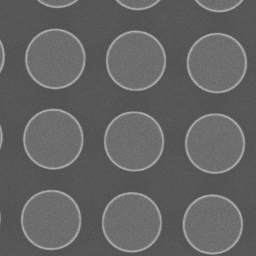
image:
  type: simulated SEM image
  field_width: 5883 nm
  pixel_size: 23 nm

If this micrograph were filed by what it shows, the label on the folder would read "an array of small figures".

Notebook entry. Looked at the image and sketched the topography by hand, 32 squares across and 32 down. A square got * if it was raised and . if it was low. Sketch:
.....****......****......*****..
................................
................................
................................
.....****......****......****...
....******....******....******..
*..********..********...*******.
*..********..********..********.
...*******...********..********.
....******....******....*******.
.....****......****.....******..
...........................*....
................................
................................
....*****......****.......**....
...*******....******....******..
...*******...*******...*******..
...*******...*******...********.
...*******...*******...********.
....******....******....******..
.....****.....*****.....******..
..........................**....
................................
................................
....*****......***.......**.....
...******.....*****.....*****...
...*******...*******...*******..
...*******...*******...*******..
...*******...*******...*******..
...*******...*******...*******..
....*****.....*****.....*****...
.........................***....